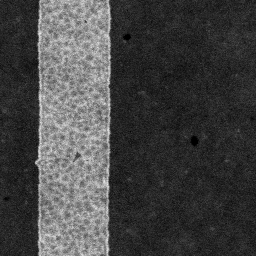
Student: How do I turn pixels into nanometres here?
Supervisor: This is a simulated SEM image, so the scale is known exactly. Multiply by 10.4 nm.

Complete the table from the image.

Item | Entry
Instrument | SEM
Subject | one or a few lines or trenches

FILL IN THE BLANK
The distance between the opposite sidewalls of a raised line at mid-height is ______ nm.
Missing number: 716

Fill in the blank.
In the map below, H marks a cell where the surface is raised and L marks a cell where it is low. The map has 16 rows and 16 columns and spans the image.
LLLHHHHLLLLLLLLL
LLHHHHHLLLLLLLLL
LLHHHHHLLLLLLLLL
LLHHHHHLLLLLLLLL
LLLHHHHLLLLLLLLL
LLLHHHHLLLLLLLLL
LLLHHHHLLLLLLLLL
LLLHHHHLLLLLLLLL
LLHHHHHLLLLLLLLL
LLHHHHHLLLLLLLLL
LLHHHHHLLLLLLLLL
LLLHHHHLLLLLLLLL
LLLHHHHLLLLLLLLL
LLHHHHHLLLLLLLLL
LLHHHHHLLLLLLLLL
LLHHHHHLLLLLLLLL